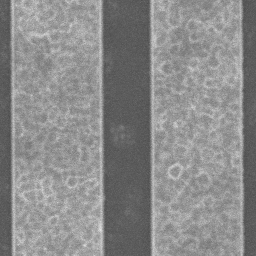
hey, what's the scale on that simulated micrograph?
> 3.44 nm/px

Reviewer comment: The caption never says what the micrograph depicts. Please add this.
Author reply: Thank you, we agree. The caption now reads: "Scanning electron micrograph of one or a few lines or trenches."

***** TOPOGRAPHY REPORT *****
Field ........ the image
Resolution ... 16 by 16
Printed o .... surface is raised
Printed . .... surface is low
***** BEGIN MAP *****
.ooooo....ooooo.
.ooooo....ooooo.
.ooooo....ooooo.
.ooooo....ooooo.
.ooooo....ooooo.
.ooooo....ooooo.
.ooooo....ooooo.
.ooooo....ooooo.
.ooooo....ooooo.
.ooooo....ooooo.
.ooooo....ooooo.
.ooooo....ooooo.
.ooooo....ooooo.
.ooooo....ooooo.
.ooooo....ooooo.
.ooooo....ooooo.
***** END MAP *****